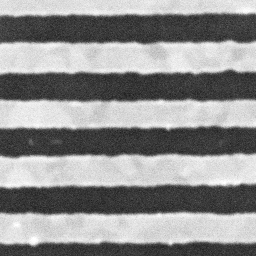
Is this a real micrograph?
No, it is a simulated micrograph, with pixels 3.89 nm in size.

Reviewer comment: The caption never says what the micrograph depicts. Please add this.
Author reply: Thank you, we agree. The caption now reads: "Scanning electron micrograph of lines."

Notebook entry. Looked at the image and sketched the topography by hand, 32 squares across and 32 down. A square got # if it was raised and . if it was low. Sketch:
################################
################################
................................
................................
................................
.####.##...#.####..##.##.#####.#
################################
################################
################################
................................
................................
................................
................................
################################
################################
################################
................................
................................
................................
.........#.#...###..###.....####
################################
################################
################################
................................
................................
................................
................................
################################
################################
################################
................................
................................